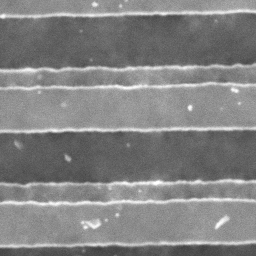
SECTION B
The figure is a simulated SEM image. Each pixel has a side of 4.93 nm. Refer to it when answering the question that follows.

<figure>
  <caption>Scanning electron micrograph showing lines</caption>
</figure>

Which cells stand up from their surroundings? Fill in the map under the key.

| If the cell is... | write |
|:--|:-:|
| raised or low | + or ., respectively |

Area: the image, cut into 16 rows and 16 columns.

++++++++++++++++
................
................
................
++++++++++++++++
++++++++++++++++
++++++++++++++++
++++++++++++++++
................
................
................
+.++++++++++++++
++++++++++++++++
++++++++++++++++
++++++++++++++++
................